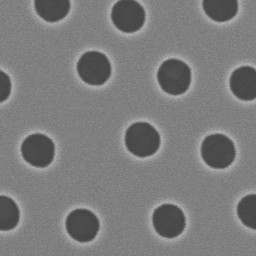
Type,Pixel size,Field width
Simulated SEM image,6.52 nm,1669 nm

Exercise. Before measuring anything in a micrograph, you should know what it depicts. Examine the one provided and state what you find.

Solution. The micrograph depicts holes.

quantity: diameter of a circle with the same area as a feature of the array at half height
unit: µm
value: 0.229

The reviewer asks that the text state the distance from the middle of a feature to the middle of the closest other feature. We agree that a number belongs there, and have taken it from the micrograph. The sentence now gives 0.527 µm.